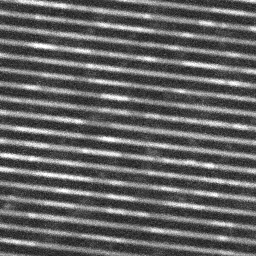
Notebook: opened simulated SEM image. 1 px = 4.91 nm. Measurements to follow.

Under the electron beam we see parallel lines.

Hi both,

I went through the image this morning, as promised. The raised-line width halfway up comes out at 17.6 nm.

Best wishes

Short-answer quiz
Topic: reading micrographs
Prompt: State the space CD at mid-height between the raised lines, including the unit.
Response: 53.6 nanometers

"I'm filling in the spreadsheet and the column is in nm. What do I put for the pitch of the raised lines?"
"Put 69.2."